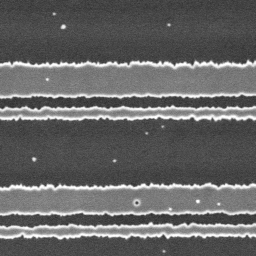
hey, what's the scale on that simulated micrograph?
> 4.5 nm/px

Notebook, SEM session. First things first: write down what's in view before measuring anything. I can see lines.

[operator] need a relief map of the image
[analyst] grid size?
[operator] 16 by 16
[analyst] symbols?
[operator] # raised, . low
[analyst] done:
................
................
................
................
################
################
################
................
................
................
................
................
################
################
################
................